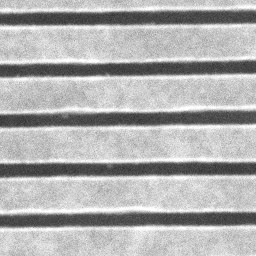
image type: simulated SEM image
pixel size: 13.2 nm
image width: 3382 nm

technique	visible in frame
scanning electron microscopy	lines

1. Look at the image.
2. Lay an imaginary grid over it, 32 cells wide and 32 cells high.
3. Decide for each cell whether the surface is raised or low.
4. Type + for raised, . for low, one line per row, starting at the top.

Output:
++++++++++++++++++++++++++++++++
................................
................................
++++++++++++++++++++++++++++++++
++++++++++++++++++++++++++++++++
++++++++++++++++++++++++++++++++
++++++++++++++++++++++++++++++++
+++++++++++++++++++++++.+++.....
................................
.........................+++++++
++++++++++++++++++++++++++++++++
++++++++++++++++++++++++++++++++
++++++++++++++++++++++++++++++++
++++++++++++++++++++++++++++++++
................................
................................
++++++++++++++++++++++++++++++++
++++++++++++++++++++++++++++++++
++++++++++++++++++++++++++++++++
++++++++++++++++++++++++++++++++
................................
................................
++++++++++++++++++++++++++++++++
++++++++++++++++++++++++++++++++
++++++++++++++++++++++++++++++++
++++++++++++++++++++++++++++++++
+++++++++++.....................
................................
.......+++++++++++++++++++++++++
++++++++++++++++++++++++++++++++
++++++++++++++++++++++++++++++++
++++++++++++++++++++++++++++++++